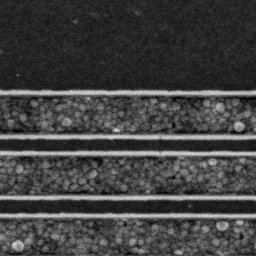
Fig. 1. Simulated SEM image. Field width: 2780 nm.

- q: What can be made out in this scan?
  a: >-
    one or a few lines or trenches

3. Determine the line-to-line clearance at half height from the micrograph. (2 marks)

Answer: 474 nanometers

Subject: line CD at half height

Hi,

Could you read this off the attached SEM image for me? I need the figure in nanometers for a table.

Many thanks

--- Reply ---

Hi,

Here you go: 190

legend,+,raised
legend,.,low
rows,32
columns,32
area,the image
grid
++++++++++++++++++++++++++++++++
++++++++++++++++++++++++++++++++
++++++++++++++++++++++++++++++++
++++++++++++++++++++++++++++++++
++++++++++++++++++++++++++++++++
++++++++++++++++++++++++++++++++
++++++++++++++++++++++++++++++++
++++++++++++++++++++++++++++++++
++++++++++++++++++++++++++++++++
++++++++++++++++++++++++++++++++
++++++++++++++++++++++++++++++++
++++++++++++++++++++++++++++++++
................................
................................
................................
................................
................................
++++++++++++++++++++++++++++++++
++++++++++++++++++++++++++++++++
................................
................................
................................
................................
................................
................................
++++++++++++++++++++++++++++++++
++++++++++++++++++++++++++++++++
................................
................................
................................
................................
................................